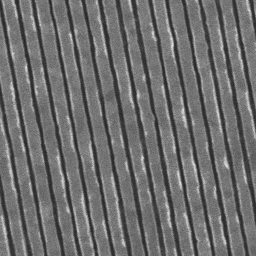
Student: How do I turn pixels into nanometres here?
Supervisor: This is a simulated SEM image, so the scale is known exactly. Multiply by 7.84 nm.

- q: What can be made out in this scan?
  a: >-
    parallel lines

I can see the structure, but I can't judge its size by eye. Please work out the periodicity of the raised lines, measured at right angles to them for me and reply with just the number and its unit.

129 nm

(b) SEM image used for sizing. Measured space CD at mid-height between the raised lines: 37.6 nanometres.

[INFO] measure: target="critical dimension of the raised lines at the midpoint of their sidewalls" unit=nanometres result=90.6